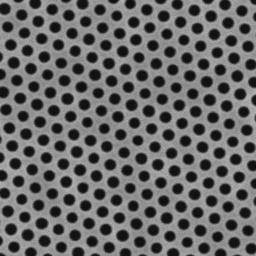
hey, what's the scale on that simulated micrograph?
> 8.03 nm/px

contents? a regular array of holes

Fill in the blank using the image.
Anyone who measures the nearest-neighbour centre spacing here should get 0.142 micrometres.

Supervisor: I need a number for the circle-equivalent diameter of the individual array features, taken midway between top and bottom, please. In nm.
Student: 95